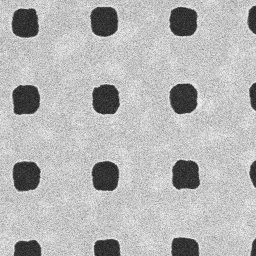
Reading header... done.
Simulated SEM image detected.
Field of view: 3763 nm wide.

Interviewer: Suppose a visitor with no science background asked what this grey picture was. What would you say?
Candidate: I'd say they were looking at a regular array of holes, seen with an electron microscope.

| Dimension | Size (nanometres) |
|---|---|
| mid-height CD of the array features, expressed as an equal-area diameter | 442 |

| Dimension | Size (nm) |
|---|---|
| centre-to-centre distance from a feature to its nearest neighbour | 1130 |